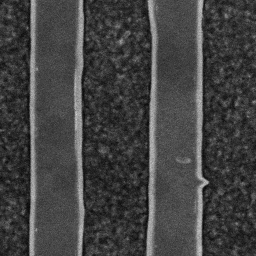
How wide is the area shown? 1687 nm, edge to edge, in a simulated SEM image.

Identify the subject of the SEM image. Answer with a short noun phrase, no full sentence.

one or a few lines or trenches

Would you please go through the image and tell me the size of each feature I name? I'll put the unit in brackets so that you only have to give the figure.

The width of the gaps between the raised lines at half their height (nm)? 475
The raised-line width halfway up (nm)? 311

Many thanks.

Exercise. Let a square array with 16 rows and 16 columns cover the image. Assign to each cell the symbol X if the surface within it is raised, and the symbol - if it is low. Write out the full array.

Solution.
--XXX----XXXX---
--XXX----XXXX---
--XXX-----XX----
--XXX-----XX----
--XXX-----XX----
--XXX-----XX----
--XXX-----XX----
--XXX-----XX----
--XXX-----XX----
--XXX-----XX----
--XXX-----XX----
--XXX----XXXX---
--XXX----XXXX---
--XXX----XXXX---
--XXX----XXX----
--XXX----XXX----